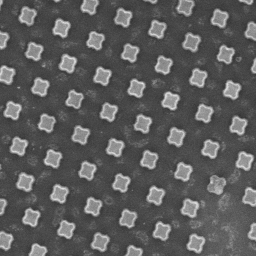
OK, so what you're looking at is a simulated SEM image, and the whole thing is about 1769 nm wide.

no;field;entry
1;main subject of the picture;a regular array of raised bodies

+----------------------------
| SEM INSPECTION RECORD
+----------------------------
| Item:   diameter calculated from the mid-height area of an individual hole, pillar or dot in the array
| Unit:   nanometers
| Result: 112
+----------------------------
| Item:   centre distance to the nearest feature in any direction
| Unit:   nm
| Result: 248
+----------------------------